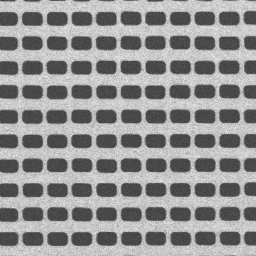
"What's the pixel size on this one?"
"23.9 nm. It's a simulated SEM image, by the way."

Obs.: a regular array of holes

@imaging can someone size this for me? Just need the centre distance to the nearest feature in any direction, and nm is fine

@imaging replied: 579